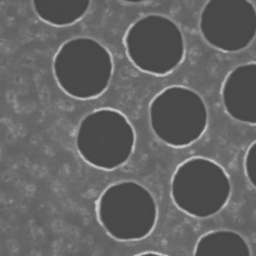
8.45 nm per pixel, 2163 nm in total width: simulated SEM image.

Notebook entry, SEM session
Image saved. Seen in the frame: holes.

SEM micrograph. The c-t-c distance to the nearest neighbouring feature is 0.633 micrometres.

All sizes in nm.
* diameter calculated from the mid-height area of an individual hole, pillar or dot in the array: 477